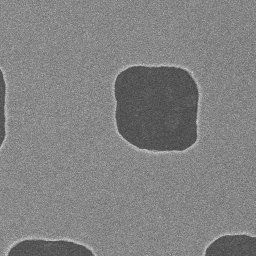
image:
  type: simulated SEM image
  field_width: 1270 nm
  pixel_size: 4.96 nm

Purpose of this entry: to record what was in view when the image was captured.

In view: holes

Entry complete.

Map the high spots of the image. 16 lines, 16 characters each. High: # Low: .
################
################
################
################
########....####
#######.....####
#######.....####
#######.....####
########....####
################
################
################
################
################
################
#....########...